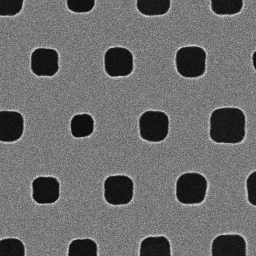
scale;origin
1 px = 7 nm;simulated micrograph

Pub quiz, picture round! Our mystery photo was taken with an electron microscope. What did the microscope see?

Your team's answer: a regular array of holes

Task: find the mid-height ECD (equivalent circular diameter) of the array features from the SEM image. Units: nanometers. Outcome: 210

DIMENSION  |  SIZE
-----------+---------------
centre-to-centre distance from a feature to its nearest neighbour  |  508 nanometres